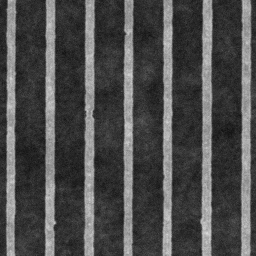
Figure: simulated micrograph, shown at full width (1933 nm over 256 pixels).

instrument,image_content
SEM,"parallel lines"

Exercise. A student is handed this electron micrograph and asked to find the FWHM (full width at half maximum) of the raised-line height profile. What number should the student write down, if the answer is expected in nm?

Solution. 59.5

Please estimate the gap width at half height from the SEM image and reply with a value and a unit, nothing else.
239 nanometers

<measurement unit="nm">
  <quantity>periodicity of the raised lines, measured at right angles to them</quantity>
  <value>296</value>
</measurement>